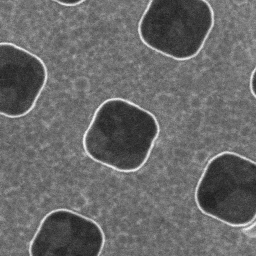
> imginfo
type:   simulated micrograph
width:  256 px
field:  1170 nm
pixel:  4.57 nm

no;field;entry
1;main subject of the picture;raised bodies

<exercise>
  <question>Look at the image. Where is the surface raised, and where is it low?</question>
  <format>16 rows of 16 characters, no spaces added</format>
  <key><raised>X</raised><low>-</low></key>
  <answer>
---------XXXX---
---------XXXX---
---------XXXX---
XX---------X----
XXX-------------
XXX-------------
XX----XX--------
------XXXX------
-----XXXXX------
-----XXXX-------
-------XX----XXX
------------XXXX
------------XXXX
---XX--------XXX
--XXXX----------
--XXXX----------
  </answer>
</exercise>